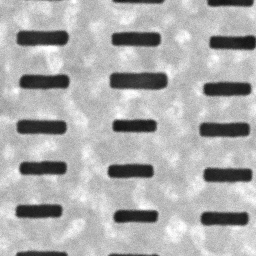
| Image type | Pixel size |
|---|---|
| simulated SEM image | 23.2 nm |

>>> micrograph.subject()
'a regular array of holes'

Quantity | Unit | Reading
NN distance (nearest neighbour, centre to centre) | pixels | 43.5